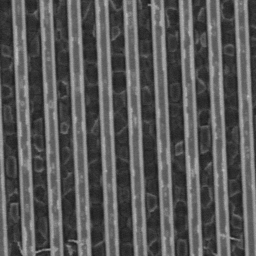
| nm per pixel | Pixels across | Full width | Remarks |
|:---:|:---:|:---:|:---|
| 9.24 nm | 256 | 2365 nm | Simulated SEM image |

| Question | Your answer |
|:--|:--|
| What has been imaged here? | parallel lines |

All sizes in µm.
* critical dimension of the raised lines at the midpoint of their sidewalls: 0.0923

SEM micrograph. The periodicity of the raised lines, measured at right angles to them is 0.257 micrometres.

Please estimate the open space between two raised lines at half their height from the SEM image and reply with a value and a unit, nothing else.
166 nm